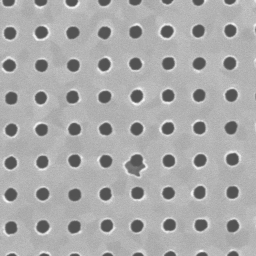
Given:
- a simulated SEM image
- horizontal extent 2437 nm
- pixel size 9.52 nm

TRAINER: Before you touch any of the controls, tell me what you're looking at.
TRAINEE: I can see a regular array of holes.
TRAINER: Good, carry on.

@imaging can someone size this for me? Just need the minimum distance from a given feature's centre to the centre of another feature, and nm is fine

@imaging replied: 297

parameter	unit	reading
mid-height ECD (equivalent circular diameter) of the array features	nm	125